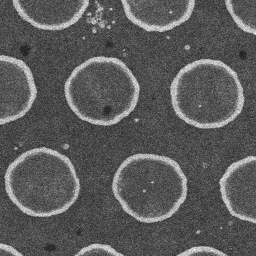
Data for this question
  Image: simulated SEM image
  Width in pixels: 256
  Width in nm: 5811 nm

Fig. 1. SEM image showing raised bodies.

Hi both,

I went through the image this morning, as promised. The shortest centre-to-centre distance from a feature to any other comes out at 2410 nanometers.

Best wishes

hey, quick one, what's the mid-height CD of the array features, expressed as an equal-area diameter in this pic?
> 67.3 px